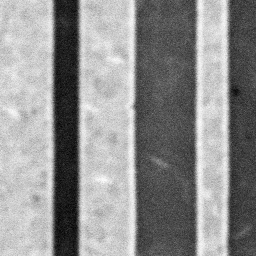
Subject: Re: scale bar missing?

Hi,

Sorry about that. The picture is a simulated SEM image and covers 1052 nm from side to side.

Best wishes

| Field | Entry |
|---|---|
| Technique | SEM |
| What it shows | one or a few lines or trenches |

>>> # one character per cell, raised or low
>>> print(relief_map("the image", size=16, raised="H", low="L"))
HHHLLHHHLLLLHHLL
HHHLLHHHLLLLHHLL
HHHLLHHHLLLLHHLL
HHHLLHHHLLLLHHLL
HHHLLHHHLLLLHHLL
HHHLLHHHLLLLHHLL
HHHLLHHHLLLLHHLL
HHHLLHHHLLLLHHLL
HHHLLHHHLLLLHHLL
HHHLLHHHLLLLHHLL
HHHLLHHHLLLLHHLL
HHHLLHHHLLLLHHLL
HHHLLHHHLLLLHHLL
HHHLLHHHLLLLHHLL
HHHLLHHHLLLLHHLL
HHHLLHHHLLLLHHLL